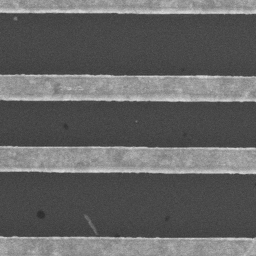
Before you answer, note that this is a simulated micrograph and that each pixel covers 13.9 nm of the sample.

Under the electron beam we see lines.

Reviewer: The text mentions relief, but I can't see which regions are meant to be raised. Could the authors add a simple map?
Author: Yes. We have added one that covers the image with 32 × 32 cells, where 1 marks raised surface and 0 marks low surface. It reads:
11111111111111111111111111111111
00000011000000001111111111111111
00000000000000000000000000000000
00000000000000000000000000000000
00000000000000000000000000000000
00000000000000000000000000000000
00000000000000000000000000000000
00000000000000000000000000000000
00000000000000000000000000000000
11111101111000000000000000000000
11111111111111111111111111111111
11111111111111111111111111111111
00000000000000000000000000000011
00000000000000000000000000000000
00000000000000000000000000000000
00000000000000000000000000000000
00000000000000000000000000000000
00000000000000000000000000000000
11111111111111100000000000000000
11111111111111111111111111111111
11111111111111111111111111111111
00000000000000000000000000000011
00000000000000000000000000000000
00000000000000000000000000000000
00000000000000000000000000000000
00000000000000000000000000000000
00000000000000000000000000000000
00000000000000000000000000000000
00000000000000000000000000000000
00000000000000000000000000000000
11111111111111111111111111111111
11111111111111111111111111111111